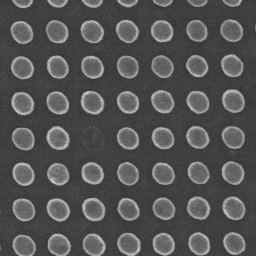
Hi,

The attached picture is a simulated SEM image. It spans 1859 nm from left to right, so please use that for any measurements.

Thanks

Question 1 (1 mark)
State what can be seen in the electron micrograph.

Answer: a regular array of raised bodies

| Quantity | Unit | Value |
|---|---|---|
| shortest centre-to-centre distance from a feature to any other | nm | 252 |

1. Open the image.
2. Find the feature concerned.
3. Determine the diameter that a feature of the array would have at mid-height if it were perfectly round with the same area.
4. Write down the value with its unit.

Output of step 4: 154 nm